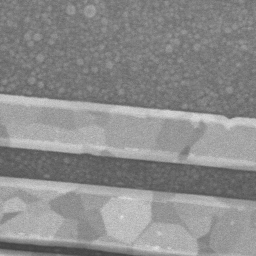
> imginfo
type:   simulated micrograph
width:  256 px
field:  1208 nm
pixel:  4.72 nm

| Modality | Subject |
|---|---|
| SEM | one or a few lines or trenches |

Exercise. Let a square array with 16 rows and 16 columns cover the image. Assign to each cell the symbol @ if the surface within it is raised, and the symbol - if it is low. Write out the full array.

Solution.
----------------
----------------
----------------
----------------
----------------
----------------
@@@@------------
@@@@@@@@@@@@@@--
@@@@@@@@@@@@@@@@
-------@@@@@@@@@
----------------
@@--------------
@@@@@@@@@@@@@---
@@@@@@@@@@@@@@@@
@@@@@@@@@@@@@@@@
-------@@@@@@@@@